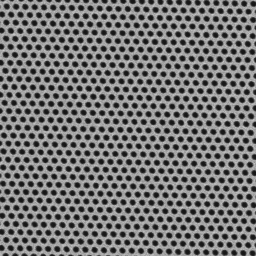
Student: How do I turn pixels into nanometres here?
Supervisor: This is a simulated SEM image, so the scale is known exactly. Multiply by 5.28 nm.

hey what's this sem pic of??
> a regular array of holes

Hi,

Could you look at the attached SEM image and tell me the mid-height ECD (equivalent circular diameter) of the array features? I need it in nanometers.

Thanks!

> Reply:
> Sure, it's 31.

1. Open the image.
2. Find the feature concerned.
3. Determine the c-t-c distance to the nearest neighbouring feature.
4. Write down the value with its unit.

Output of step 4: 47.8 nm